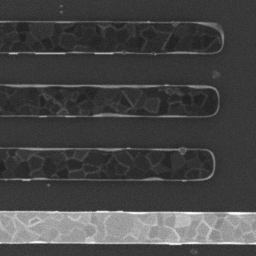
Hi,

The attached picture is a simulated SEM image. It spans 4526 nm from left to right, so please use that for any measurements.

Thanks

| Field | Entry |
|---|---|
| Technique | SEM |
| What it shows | groups of lines, slits or small figures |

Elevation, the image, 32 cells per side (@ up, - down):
--------------------------------
--------------------------------
--------------------------------
@@@@@@@@@@@@@@@@@@@@@@@@@@@-----
@@@@@@@@@@@@@@@@@@@@@@@@@@@@----
@@@@@@@@@@@@@@@@@@@@@@@@@@@@----
@@@@@@@@@-@@@@@@@@@@@@@@@@@-----
--------------------------------
--------------------------------
--------------------------------
--------------------------------
@@@@@@@@@@@@@@@@@@@@@@@@@@@-----
@@@@@@@@@@@@@@@@@@@@@@@@@@@-----
@@@@@@@@@@@@@@@@@@@@@@@@@@@-----
-----------------------@@@------
--------------------------------
--------------------------------
--------------------------------
--------------------------------
@@@@@@@@@@@@@@@@@@@@@@@@@@@-----
@@@@@@@@@@@@@@@@@@@@@@@@@@@-----
@@@@@@@@@@@@@@@@@@@@@@@@@@@-----
-----------------@--@@@@@-------
--------------------------------
--------------------------------
--------------------------------
--------------------------------
@@@@@@@@@@@@@@@@@@@@@@@@@@@@@@@@
@@@@@@@@@@@@@@@@@@@@@@@@@@@@@@@@
@@@@@@@@@@@@@@@@@@@@@@@@@@@@@@@@
--------------------------------
--------------------------------